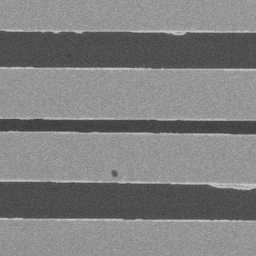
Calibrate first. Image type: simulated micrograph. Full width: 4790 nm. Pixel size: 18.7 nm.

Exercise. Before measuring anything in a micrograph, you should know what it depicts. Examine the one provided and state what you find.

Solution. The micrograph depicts lines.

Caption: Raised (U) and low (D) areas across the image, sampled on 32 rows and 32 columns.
UUUUUUUUUUUUUUUUUUUUUUUUUUUUUUUU
UUUUUUUUUUUUUUUUUUUUUUUUUUUUUUUU
UUUUUUUUUUUUUUUUUUUUUUUUUUUUUUUU
UUUUUUUUUUUUUUUUUUUUUUUUUUUUUUUU
DDDDDDDDDDDDDDDDDDDDDDDDDDDDDDDD
DDDDDDDDDDDDDDDDDDDDDDDDDDDDDDDD
DDDDDDDDDDDDDDDDDDDDDDDDDDDDDDDD
DDDDDDDDDDDDDDDDDDDDDDDDDDDDDDDD
UUUUDDDDDDDDDDDDDDDDDDDDDDDDDDDD
UUUUUUUUUUUUUUUUUUUUUUUUUUUUUUUU
UUUUUUUUUUUUUUUUUUUUUUUUUUUUUUUU
UUUUUUUUUUUUUUUUUUUUUUUUUUUUUUUU
UUUUUUUUUUUUUUUUUUUUUUUUUUUUUUUU
UUUUUUUUUUUUUUUUUUUUUUUUUUUUUUUU
UUUUUUUUUUUUUUUUUUUUUUUUUUUUUUUU
DDDDDDDDDDDDDDDDDDDDDDDDDDDDDDDD
DDDDDDDDDDDDDDDDDDDDDDDDDDDDDDDD
UUUUUUUUUUUUUUUUUUUUUUUUUUUUUUUU
UUUUUUUUUUUUUUUUUUUUUUUUUUUUUUUU
UUUUUUUUUUUUUUUUUUUUUUUUUUUUUUUU
UUUUUUUUUUUUUUUUUUUUUUUUUUUUUUUU
UUUUUUUUUUUUUUUUUUUUUUUUUUUUUUUU
UUUUUUUUUUUUUUUUUUUUUUUUUUUUUUUU
DDDDDDDDDDDDDDDDDDDDDDDDDDDDDDDD
DDDDDDDDDDDDDDDDDDDDDDDDDDDDDDDD
DDDDDDDDDDDDDDDDDDDDDDDDDDDDDDDD
DDDDDDDDDDDDDDDDDDDDDDDDDDDDDDDD
UUUUUUUUUUUUUUUUDUDDDDDDDDDDDDDD
UUUUUUUUUUUUUUUUUUUUUUUUUUUUUUUU
UUUUUUUUUUUUUUUUUUUUUUUUUUUUUUUU
UUUUUUUUUUUUUUUUUUUUUUUUUUUUUUUU
UUUUUUUUUUUUUUUUUUUUUUUUUUUUUUUU